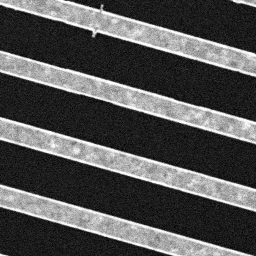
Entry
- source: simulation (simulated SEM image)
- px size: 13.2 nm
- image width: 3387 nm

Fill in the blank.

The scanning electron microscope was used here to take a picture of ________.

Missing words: one or a few lines or trenches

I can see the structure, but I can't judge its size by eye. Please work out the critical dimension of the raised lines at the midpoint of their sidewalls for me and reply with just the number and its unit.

260 nm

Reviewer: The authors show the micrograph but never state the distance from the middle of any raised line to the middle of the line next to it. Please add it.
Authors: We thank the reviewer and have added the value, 859 nm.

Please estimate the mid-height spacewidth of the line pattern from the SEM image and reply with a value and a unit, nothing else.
0.603 microns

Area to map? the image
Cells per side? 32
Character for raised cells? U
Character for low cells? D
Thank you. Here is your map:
UUUUUUUUUDDDDDDDDDDDDDDDDDDDDDDU
DDDDUUUUUUUUUDDDDDDDDDDDDDDDDDDD
DDDDDDDDUUUUUUUUDDDDDDDDDDDDDDDD
DDDDDDDDDDDUUUUUUUUUDDDDDDDDDDDD
DDDDDDDDDDDDDDDUUUUUUUUDDDDDDDDD
DDDDDDDDDDDDDDDDDDUUUUUUUUUDDDDD
DDDDDDDDDDDDDDDDDDDDDDUUUUUUUUDD
UUUUDDDDDDDDDDDDDDDDDDDDDUUUUUUU
UUUUUUUDDDDDDDDDDDDDDDDDDDDDDUUU
DDDUUUUUUUUDDDDDDDDDDDDDDDDDDDDD
DDDDDDUUUUUUUUDDDDDDDDDDDDDDDDDD
DDDDDDDDDDUUUUUUUUDDDDDDDDDDDDDD
DDDDDDDDDDDDDUUUUUUUUDDDDDDDDDDD
DDDDDDDDDDDDDDDDDUUUUUUUUDDDDDDD
DDDDDDDDDDDDDDDDDDDDUUUUUUUUDDDD
UUUDDDDDDDDDDDDDDDDDDDDDUUUUUUUU
UUUUUUDDDDDDDDDDDDDDDDDDDDDUUUUU
DUUUUUUUUUDDDDDDDDDDDDDDDDDDDDDU
DDDDUUUUUUUUUDDDDDDDDDDDDDDDDDDD
DDDDDDDDUUUUUUUUUDDDDDDDDDDDDDDD
DDDDDDDDDDDUUUUUUUUUDDDDDDDDDDDD
DDDDDDDDDDDDDDDUUUUUUUUUDDDDDDDD
DDDDDDDDDDDDDDDDDDUUUUUUUUUDDDDD
UDDDDDDDDDDDDDDDDDDDDDUUUUUUUUUD
UUUUDDDDDDDDDDDDDDDDDDDDDDUUUUUU
UUUUUUUUDDDDDDDDDDDDDDDDDDDDDUUU
DDDUUUUUUUUUDDDDDDDDDDDDDDDDDDDD
DDDDDDUUUUUUUUUDDDDDDDDDDDDDDDDD
DDDDDDDDDDUUUUUUUUUDDDDDDDDDDDDD
DDDDDDDDDDDDDUUUUUUUUUDDDDDDDDDD
DDDDDDDDDDDDDDDDDUUUUUUUUUDDDDDD
DDDDDDDDDDDDDDDDDDDDDUUUUUUUUDDD